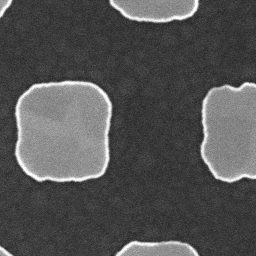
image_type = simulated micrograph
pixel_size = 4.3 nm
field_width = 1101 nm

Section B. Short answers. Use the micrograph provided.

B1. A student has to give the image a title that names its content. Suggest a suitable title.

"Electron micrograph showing raised bodies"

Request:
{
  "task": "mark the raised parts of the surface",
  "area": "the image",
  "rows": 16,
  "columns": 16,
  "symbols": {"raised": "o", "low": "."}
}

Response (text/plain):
.......ooooo....
................
................
................
................
..oooo........oo
.oooooo......ooo
.oooooo......ooo
.oooooo......ooo
.oooooo......ooo
.oooooo......ooo
................
................
................
................
........oooo....